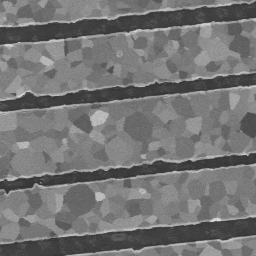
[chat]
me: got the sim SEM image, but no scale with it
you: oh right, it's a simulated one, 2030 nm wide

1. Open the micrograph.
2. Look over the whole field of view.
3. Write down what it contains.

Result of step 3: one or a few lines or trenches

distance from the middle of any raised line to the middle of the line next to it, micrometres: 0.57